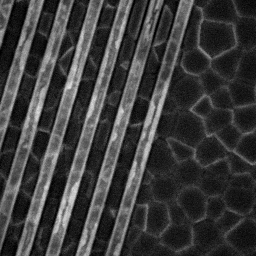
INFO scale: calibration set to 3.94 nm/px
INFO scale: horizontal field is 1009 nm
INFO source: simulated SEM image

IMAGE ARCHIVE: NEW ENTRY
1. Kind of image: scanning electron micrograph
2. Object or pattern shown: parallel lines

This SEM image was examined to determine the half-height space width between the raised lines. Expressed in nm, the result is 72.3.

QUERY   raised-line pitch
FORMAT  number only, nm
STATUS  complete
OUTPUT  113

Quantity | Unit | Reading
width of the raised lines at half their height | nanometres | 42.1